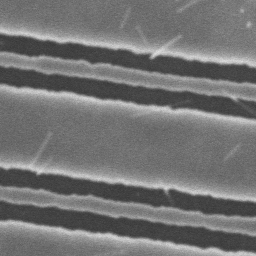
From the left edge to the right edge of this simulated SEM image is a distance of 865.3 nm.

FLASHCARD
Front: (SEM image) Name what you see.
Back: lines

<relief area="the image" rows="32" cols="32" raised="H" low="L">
HHHHHHHHHHHHHHHHHHHHHHHHHHHHHHHH
HHHHHHHHHHHHHHHHHHHHHHHHHHHHHHHH
HHHHHHHHHHHHHHHHHHHHHHHHHHHHHHHH
HHHHHHHHHHHHHHHHHHHHHHHHHHHHHHHH
LLLHHHHHHHHHHHHHHHHHHHHHHHHHHHHH
LLLLLLLLLLLHHHHHHHHHHHHHHHHHHHHH
LLLLLLLLLLLLLLLLLHHHHHHHHHHHHHHH
HHHHHHHHLLLLLLLLLLLLLLLLLHHHHHHH
LLHHHHHHHHHHHHHLLLLLLLLLLLLLLLLL
LLLLLLLLLLHHHHHHHHHHHHLLLLLLLLLL
LLLLLLLLLLLLLLLLHHHHHHHHHHHHHHHH
HHHHHHLLLLLLLLLLLLLLLLLLHHHHHHHH
HHHHHHHHHHHHLLLLLLLLLLLLLLLLLLLH
HHHHHHHHHHHHHHHHHHHHHLLLLLLLLLLL
HHHHHHHHHHHHHHHHHHHHHHHHHHHHLLLL
HHHHHHHHHHHHHHHHHHHHHHHHHHHHHHHH
HHHHHHHHHHHHHHHHHHHHHHHHHHHHHHHH
HHHHHHHHHHHHHHHHHHHHHHHHHHHHHHHH
HHHHHHHHHHHHHHHHHHHHHHHHHHHHHHHH
HHHHHHHHHHHHHHHHHHHHHHHHHHHHHHHH
HHHHHHHHHHHHHHHHHHHHHHHHHHHHHHHH
LLLLHHHHHHHHHHHHHHHHHHHHHHHHHHHH
LLLLLLLLLLLLHHHHHHHHHHHHHHHHHHHH
HHLLLLLLLLLLLLLLLLLHHHHHHHHHHHHH
HHHHHHHHLHLLLLLLLLLLLLLLLLHHHHHH
LLLLHHHHHHHHHHHHHHLLLLLLLLLLLLLL
LLLLLLLLLLLLHHHHHHHHHHHHHLLLLLLL
LLLLLLLLLLLLLLLLLLHHHHHHHHHHHHHH
HHHHHHHLLLLLLLLLLLLLLLLLLLHHHHHH
HHHHHHHHHHHHHHHLLLLLLLLLLLLLLLLL
HHHHHHHHHHHHHHHHHHHHHHLLLLLLLLLL
HHHHHHHHHHHHHHHHHHHHHHHHHHHHLLHL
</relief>